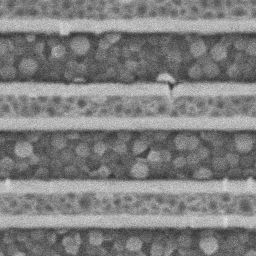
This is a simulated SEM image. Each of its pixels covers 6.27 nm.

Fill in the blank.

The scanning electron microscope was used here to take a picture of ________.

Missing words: one or a few lines or trenches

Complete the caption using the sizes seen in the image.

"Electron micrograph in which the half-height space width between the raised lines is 406 nm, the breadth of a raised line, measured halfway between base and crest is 203 nanometres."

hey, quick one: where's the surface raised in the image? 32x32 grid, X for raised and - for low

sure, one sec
XXXXXXXXXXXXXXXXXXXXXXXXXXXXXXXX
XXXXXXXXXXXXXXXXXXXXXXXXXXXXXXXX
XXXXXXXXXXXXXXXXXXXXXXXXXXXXXXXX
--------------------------------
--------------------------------
--------------------------------
--------------------------------
--------------------------------
--------------------------------
--------------------------------
--------------------------------
XXXXXXXX-XXXXXXXXXXXX-XXXXXXXXXX
XXXXXXXXXXXXXXXXXXXXXXXXXXXXXXXX
XXXXXXXXXXXXXXXXXXXXXXXXXXXXXXXX
XXXXXXXXXXXXXXXXXXXXXXXXXXXXXXXX
--------------------------------
--------------------------------
--------------------------------
--------------------------------
--------------------------------
--------------------------------
--------------------------------
--------------------------------
XX-XX--XXXXXX--XXXXXXXXXXXXXX-XX
XXXXXXXXXXXXXXXXXXXXXXXXXXXXXXXX
XXXXXXXXXXXXXXXXXXXXXXXXXXXXXXXX
XXXXXXXXXXXXXXXXXXXXXXXXXXXXXXXX
XXXXXXXXXX-X--X------XX-XXXXX-XX
--------------------------------
--------------------------------
--------------------------------
--------------------------------